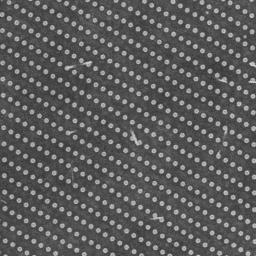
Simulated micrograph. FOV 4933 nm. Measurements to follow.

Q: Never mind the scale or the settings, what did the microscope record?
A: a regular array of raised bodies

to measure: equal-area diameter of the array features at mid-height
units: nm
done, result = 81.3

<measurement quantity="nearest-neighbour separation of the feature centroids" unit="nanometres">158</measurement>